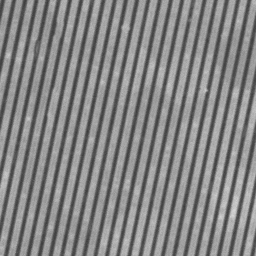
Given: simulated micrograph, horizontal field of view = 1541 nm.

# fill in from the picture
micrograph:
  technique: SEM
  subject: parallel lines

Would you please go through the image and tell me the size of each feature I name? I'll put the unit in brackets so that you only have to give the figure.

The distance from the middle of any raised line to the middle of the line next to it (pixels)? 11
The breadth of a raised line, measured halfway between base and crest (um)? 0.0383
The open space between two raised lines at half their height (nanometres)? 28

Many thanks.